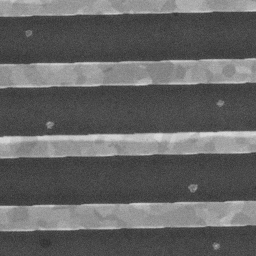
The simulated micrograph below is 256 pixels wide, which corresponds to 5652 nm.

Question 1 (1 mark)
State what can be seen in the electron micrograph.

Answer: lines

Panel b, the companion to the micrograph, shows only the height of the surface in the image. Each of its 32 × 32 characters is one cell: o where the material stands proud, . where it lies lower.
oooooooooooooooooooooooooooooooo
ooooooooooooooooooooo...........
................................
................................
................................
................................
................................
...............................o
oooooooooooooooooooooooooooooooo
oooooooooooooooooooooooooooooooo
oooooooooooooooooo..............
................................
................................
................................
................................
................................
................................
.ooooooooooooooooooooooooooooooo
oooooooooooooooooooooooooooooooo
oooooooo........................
................................
................................
................................
................................
................................
................oooooooooooooooo
oooooooooooooooooooooooooooooooo
oooooooooooooooooooooooooooooooo
ooooooooooooooo.................
................................
................................
................................